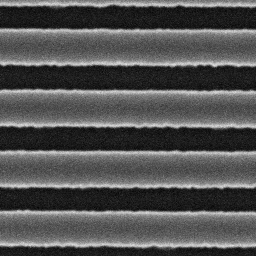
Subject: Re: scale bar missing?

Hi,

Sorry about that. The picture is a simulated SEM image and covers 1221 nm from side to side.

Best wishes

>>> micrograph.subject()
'lines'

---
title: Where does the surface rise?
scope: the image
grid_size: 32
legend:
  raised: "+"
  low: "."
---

++++++++++++++++++++++++++++++++
................................
................................
................................
++++++++++++++++++++++++++++++++
++++++++++++++++++++++++++++++++
++++++++++++++++++++++++++++++++
++++++++++++++++++++++++++++++++
................................
................................
................................
++++++++++++++++++++++++++++++++
++++++++++++++++++++++++++++++++
++++++++++++++++++++++++++++++++
++++++++++++++++++++++++++++++++
++++++++++++++++++++++++++++++++
................................
................................
................................
++++++++++++++++++++++++++++++++
++++++++++++++++++++++++++++++++
++++++++++++++++++++++++++++++++
++++++++++++++++++++++++++++++++
................................
................................
................................
++++++++++++.+++++++...+.+......
++++++++++++++++++++++++++++++++
++++++++++++++++++++++++++++++++
++++++++++++++++++++++++++++++++
++++++++++++++++++++++++++++++++
................................